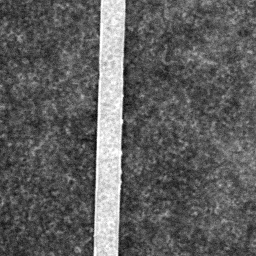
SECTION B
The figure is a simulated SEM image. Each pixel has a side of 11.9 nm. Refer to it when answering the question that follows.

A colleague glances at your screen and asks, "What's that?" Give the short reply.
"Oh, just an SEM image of one or a few lines or trenches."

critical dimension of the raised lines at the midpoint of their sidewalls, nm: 274